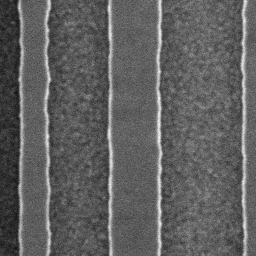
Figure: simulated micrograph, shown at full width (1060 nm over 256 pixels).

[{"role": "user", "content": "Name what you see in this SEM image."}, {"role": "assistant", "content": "lines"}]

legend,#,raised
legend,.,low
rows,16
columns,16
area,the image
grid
.##....###.....#
.##....###.....#
.##....###.....#
.##....###.....#
.##....###.....#
.##....###.....#
.##....###.....#
.##....###.....#
.##....###.....#
.##....###.....#
.##....###.....#
.##....###.....#
.##....###.....#
.##....###.....#
.##....###.....#
.##....###.....#